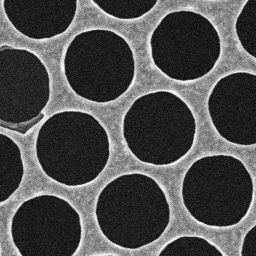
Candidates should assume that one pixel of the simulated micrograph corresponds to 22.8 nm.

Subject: holes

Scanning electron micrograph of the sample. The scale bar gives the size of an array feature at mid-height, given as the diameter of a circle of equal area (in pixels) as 73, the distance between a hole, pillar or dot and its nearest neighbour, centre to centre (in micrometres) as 1.98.